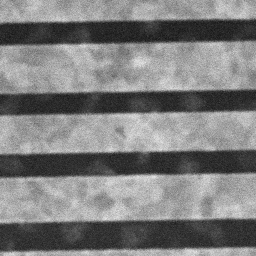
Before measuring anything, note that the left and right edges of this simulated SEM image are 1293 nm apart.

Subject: one or a few lines or trenches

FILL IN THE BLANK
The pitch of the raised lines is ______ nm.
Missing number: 330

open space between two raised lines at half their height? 124 nm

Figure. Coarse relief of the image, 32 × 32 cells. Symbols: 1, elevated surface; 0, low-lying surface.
11111111111111111111111111111111
11111111111111111111111111111111
11111111111100000000000000000000
00000000000000000000000000000000
00000000000000000000000000000000
00000000000000000001111111111111
11111111111111111111111111111111
11111111111111111111111111111111
11111111111111111111111111111111
11111111111111111111111111111111
11111111111111111111111111111111
11000000000000000000000000000000
00000000000000000000000000000000
00000000000000000000000000000000
00000011111111111111111111111111
11111111111111111111111111111111
11111111111111111111111111111111
11111111111111111111111111111111
11111111111111111111111111111111
00000000000000000000000000000000
00000000000000000000000000000000
00000000000000000000000000000000
11111111111111111111111111111111
11111111111111111111111111111111
11111111111111111111111111111111
11111111111111111111111111111111
11111111111111111111111111111111
11111111111111000000000000000000
00000000000000000000000000000000
00000000000000000000000000000000
00000000000000000000000000000000
00000001111111111111111111111111